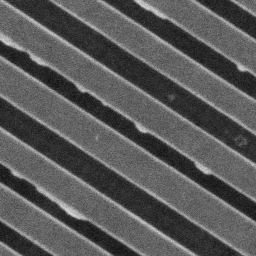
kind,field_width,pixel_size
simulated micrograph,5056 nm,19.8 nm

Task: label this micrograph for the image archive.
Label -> lines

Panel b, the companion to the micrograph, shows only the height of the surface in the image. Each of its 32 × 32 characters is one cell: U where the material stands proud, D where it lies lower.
UDDDDDDUUUUUUDDDDDUUUUUUUDDDDDUU
UUUDDDDDUUUUUUUDDDDDUUUUUUUDDDDU
UUUUDDDDDDUUUUUUDDDDDUUUUUUUDDDD
UUUUUUDDDDDDUUUUUUDDDDDUUUUUUUDD
UUUUUUUDDDDDDUUUUUUUDDDDUUUUUUUD
DDUUUUUUUDDDDDDUUUUUUDDDDDUUUUUU
DDDUUUUUUUDDDDDDUUUUUUUDDDDUUUUU
UDDDDUUUUUUUDDDDDDUUUUUUDDDDDUUU
UUDDDDUUUUUUUDDDDDDUUUUUUUDDDDUU
UUUUDDDDUUUUUUUDDDDDDUUUUUUDDDDD
UUUUUDDDDUUUUUUUDDDDDDUUUUUUUDDD
UUUUUUUDDDDUUUUUUUDDDDDDUUUUUUDD
DUUUUUUUDDDDUUUUUUUUDDDDDUUUUUUU
DDUUUUUUUUDDDDUUUUUUUDDDDDDUUUUU
DDDDUUUUUUUUDDDUUUUUUUUDDDDDUUUU
DDDDDUUUUUUUUDDDDUUUUUUUDDDDDDUU
UDDDDDDUUUUUUUUDDDDUUUUUUUDDDDDU
UUDDDDDDUUUUUUUUDDDDUUUUUUUDDDDD
UUUUDDDDDDUUUUUUUUDDDDUUUUUUUDDD
UUUUUUDDDDDUUUUUUUUDDDDUUUUUUUDD
UUUUUUUDDDDDDUUUUUUUUDDDDUUUUUUU
DDUUUUUUUDDDDDDUUUUUUUDDDDUUUUUU
DDDUUUUUUUDDDDDDUUUUUUUUDDDDUUUU
UDDDDUUUUUUUDDDDDDUUUUUUUDDDDUUU
UUUDDDUUUUUUUDDDDDDUUUUUUUUDDDDU
UUUUDDDDUUUUUUUDDDDDDUUUUUUUDDDD
UUUUUUDDDUUUUUUUDDDDDDUUUUUUUUDD
UUUUUUUDDDDUUUUUUUDDDDDDUUUUUUUD
DUUUUUUUUDDDUUUUUUUDDDDDDUUUUUUU
DDDUUUUUUUDDDDUUUUUUUDDDDDDUUUUU
DDDDUUUUUUUUDDDDUUUUUUDDDDDDUUUU
UUDDDDUUUUUUUDDDDUUUUUUUDDDDDDUU